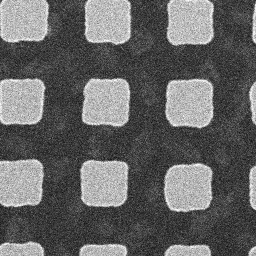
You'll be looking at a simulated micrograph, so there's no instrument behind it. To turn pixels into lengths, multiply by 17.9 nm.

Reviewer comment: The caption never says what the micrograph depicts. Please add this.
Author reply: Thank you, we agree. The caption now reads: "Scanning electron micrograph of raised bodies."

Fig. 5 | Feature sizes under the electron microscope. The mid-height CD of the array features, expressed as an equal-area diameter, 887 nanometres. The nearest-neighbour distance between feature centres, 1.47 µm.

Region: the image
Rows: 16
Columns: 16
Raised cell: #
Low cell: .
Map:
###..###...##...
####.###...##...
.#....##...##...
................
................
###..###...##...
###..###..###...
##...###...##...
................
................
###..###...##...
###..###..###...
##...###..###...
................
................
##...###...##...